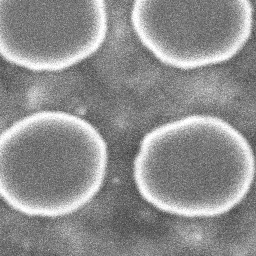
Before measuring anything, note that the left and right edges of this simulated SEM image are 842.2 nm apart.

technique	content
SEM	raised bodies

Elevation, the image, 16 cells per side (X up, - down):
XXXXXX--XXXXXXXX
XXXXXX--XXXXXXXX
XXXXXX---XXXXXX-
XXXXX-----XXXX--
----------------
----------------
----------------
--XXX-------X---
XXXXXX---XXXXXX-
XXXXXX---XXXXXXX
XXXXXX---XXXXXXX
XXXXXX---XXXXXXX
-XXXX----XXXXXX-
----------------
----------------
----------------